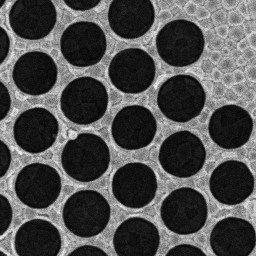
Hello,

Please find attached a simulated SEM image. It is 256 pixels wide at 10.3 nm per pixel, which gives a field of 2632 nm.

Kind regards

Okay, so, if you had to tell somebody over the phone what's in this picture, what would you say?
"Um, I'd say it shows a regular array of holes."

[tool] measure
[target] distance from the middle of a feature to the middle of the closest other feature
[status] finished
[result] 55.5 pixels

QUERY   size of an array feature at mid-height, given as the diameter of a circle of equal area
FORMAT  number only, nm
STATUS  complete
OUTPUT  476